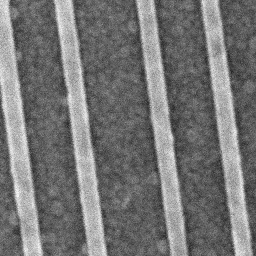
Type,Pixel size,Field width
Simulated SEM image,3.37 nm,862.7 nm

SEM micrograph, one or a few lines or trenches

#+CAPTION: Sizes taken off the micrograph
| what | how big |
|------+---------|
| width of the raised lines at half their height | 52.5 nm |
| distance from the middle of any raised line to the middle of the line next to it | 237 nm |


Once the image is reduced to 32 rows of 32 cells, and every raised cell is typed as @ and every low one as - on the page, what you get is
@------@@--------@@------@@-----
@------@@--------@@------@@-----
@------@@---------@-------@-----
@------@@---------@@------@@----
@-------@@--------@@------@@----
@@------@@--------@@------@@----
@@------@@--------@@------@@----
@@------@@--------@@------@@----
@@------@@--------@@------@@----
@@------@@--------@@-------@----
@@------@@---------@-------@@---
@@-------@---------@@------@@---
@@@------@@--------@@------@@---
-@@------@@--------@@------@@---
-@@------@@--------@@------@@---
-@@------@@--------@@------@@---
-@@------@@--------@@------@@---
-@@------@@---------@@------@@--
-@@------@@---------@@------@@--
-@@-------@@--------@@------@@--
--@@------@@--------@@------@@--
--@@------@@--------@@------@@--
--@@------@@--------@@------@@--
--@@------@@--------@@------@@--
--@@------@@--------@@-------@--
--@@------@@---------@-------@@-
--@@------@@---------@@------@@-
---@@------@@--------@@------@@-
---@@------@@--------@@------@@-
---@@------@@--------@@------@@-
---@@------@@--------@@------@@-
---@@------@@--------@@------@@-